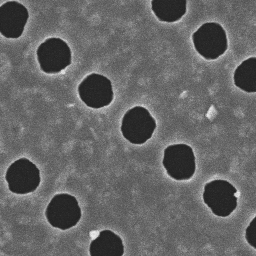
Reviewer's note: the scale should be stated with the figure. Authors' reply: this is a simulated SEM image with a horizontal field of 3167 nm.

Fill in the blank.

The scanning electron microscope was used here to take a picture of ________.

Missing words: a regular array of holes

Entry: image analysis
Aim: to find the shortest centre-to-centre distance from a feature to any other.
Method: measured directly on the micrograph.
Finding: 671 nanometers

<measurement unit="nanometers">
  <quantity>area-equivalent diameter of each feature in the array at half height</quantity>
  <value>437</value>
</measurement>